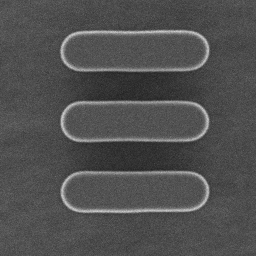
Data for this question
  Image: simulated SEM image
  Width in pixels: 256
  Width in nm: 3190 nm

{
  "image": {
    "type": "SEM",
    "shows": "groups of lines, slits or small figures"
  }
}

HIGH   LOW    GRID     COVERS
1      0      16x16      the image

0000000000000000
0000000000000000
0000111111111000
0000111111111000
0000000000000000
0000000000000000
0000011111110000
0000111111111000
0000111111111000
0000000000000000
0000000000000000
0000111111111000
0000111111111000
0000000000000000
0000000000000000
0000000000000000